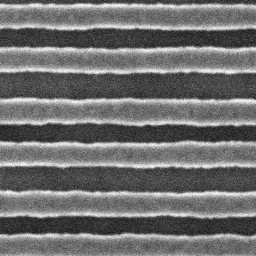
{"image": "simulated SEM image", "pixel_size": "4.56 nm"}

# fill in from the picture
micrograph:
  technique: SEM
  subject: lines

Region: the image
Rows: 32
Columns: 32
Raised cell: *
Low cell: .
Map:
................................
********************************
********************************
.......****.........*********...
................................
................................
********************************
********************************
********************************
................................
................................
................................
.****..........**...............
********************************
********************************
....*..........*****....********
................................
................................
********************************
********************************
********************************
................................
................................
................................
********************************
********************************
********************************
................................
................................
************..*******.....****..
********************************
********************************